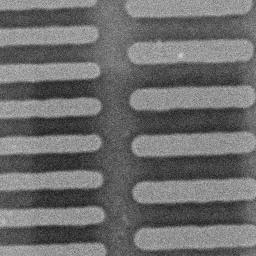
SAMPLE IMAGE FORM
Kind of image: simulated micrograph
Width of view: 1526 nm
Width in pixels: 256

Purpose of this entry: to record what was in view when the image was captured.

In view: groups of lines, slits or small figures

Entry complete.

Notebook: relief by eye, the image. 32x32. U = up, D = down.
UUUUUUUUUUUUDDDDUUUUUUUUUUUUUUUD
DDDDDDDDDDDDDDDDUUUUUUUUUUUUUUUD
DDDDDDDDDDDDDDDDDDDDDDDDDDDDDDDD
DDDDDUUUUUUUDDDDDDDDDDDDDDDDDDDD
UUUUUUUUUUUUDDDDDDDDDDDDDDDDDDDD
UUUUUUUDDDDDDDDDDUUUUUUUUUUUUUUD
DDDDDDDDDDDDDDDDUUUUUUUUUUUUUUUU
DDDDDDDDDDDDDDDDUUUUUUUUUUUUUUUD
UUUUUUUUUUUUDDDDDDDDDDDDDDDDDDDD
UUUUUUUUUUUUDDDDDDDDDDDDDDDDDDDD
DDDDDDDDDDDDDDDDDDDDDDDDDDDDDDDD
DDDDDDDDDDDDDDDDDUUUUUUUUUUUUUUU
DDDDDDUUUUUUDDDDUUUUUUUUUUUUUUUU
UUUUUUUUUUUUDDDDDUUUUUDDDDDDDDDD
UUUUUUUUDDDDDDDDDDDDDDDDDDDDDDDD
DDDDDDDDDDDDDDDDDDDDDDDDDDDDDDDD
DDDDDDDDDDDDDDDDDDDDDDDDDDDDDDDD
UUUUUUUUUUUUDDDDDUUUUUUUUUUUUUUU
UUUUUUUUUUUUDDDDDUUUUUUUUUUUUUUU
DDDDDDDDDDDDDDDDDDDDDDDDDDDDDDDD
DDDDDDDDDDDDDDDDDDDDDDDDDDDDDDDD
DDDDDDDDDUUDDDDDDDDDDDDDDDDDDDDD
UUUUUUUUUUUUUDDDDDDDDDDDDDDDUUUU
UUUUUUUUUDDDDDDDDUUUUUUUUUUUUUUU
DDDDDDDDDDDDDDDDDUUUUUUUUUUUUUUU
DDDDDDDDDDDDDDDDDDDDDDDDDDDDDDDD
UUUUUUUUUUUUUDDDDDDDDDDDDDDDDDDD
UUUUUUUUUUUUUDDDDDDDDDDDDDDDDDDD
DDDDDDDDDDDDDDDDDDDDDUUUUUUUUUUU
DDDDDDDDDDDDDDDDDUUUUUUUUUUUUUUU
DDDDDDDDDDUUUDDDDUUUUUUUUUUUUUUU
UUUUUUUUUUUUUDDDDDDDDDDDDDDDDDDD